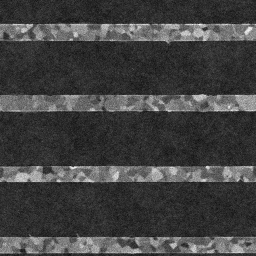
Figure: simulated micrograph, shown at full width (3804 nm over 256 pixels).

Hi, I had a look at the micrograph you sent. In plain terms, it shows one or a few lines or trenches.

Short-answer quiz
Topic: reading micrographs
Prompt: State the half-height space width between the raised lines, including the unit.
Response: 0.821 um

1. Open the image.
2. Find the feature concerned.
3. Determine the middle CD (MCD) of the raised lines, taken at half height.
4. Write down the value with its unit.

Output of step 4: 0.23 µm